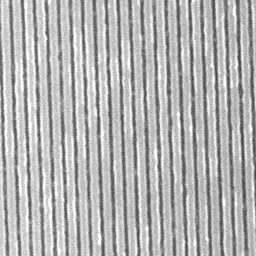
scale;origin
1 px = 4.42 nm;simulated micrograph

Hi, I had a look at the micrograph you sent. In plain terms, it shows parallel lines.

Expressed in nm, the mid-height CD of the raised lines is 33.7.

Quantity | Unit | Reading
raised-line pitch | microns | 0.0527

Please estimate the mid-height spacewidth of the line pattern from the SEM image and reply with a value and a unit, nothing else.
18.8 nm